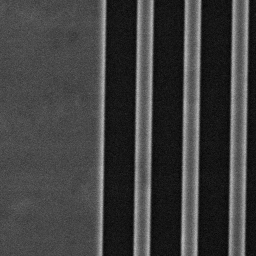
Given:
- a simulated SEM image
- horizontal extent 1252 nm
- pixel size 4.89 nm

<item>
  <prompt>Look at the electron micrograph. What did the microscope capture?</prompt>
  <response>groups of lines, slits or small figures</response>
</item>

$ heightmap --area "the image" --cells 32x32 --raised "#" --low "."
#############....##....##....##.
#############....##....##....##.
#############....##....##....##.
#############....##....##....##.
#############....##....##....##.
#############....##....##....##.
#############....##....##....##.
#############....##....##....##.
#############....##....##....##.
#############....##....##....##.
#############....##....##....##.
#############....##....##....##.
#############....##....##....##.
#############....##....##....##.
#############....##....##....##.
#############....##....##....##.
#############....##....##....##.
#############....##....##....##.
#############....##....##....##.
#############....##....##....##.
#############....##....##....##.
#############....##....##....##.
#############....##....##....##.
#############....##....##....##.
#############....##....##....##.
#############....##....##....##.
#############....##....##....##.
#############....##....##....##.
#############....##....##....##.
#############....##....##....##.
#############....##....##....##.
#############....##....##....##.